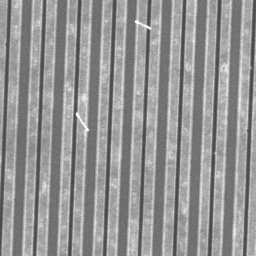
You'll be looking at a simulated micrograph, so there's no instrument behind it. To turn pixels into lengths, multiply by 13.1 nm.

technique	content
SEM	parallel lines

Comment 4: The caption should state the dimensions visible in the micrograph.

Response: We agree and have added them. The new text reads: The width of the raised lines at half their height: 138 nanometers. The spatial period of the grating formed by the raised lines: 234 nm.